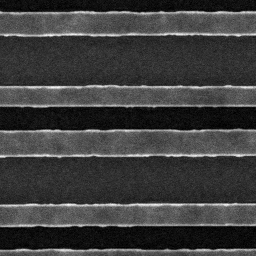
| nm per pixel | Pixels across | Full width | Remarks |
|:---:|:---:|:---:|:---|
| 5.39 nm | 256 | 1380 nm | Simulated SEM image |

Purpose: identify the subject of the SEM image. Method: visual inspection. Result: lines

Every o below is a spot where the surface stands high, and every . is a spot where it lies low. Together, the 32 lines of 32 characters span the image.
................................
.........ooo.oooo...o.oooo.oo.oo
oooooooooooooooooooooooooooooooo
oooooooooooooooooooooooooooooooo
................................
................................
................................
................................
................................
................................
................................
oooooooooooooooooooooooooooooooo
oooooooooooooooooooooooooooooooo
................................
................................
................................
oooooooooooooooooooooooooooooooo
oooooooooooooooooooooooooooooooo
oooooooooooooooooooooooooooooooo
ooooooooooooooooooo.ooooooo..oo.
................................
................................
................................
................................
................................
................................
oooooooooooooooooooooooooooooooo
oooooooooooooooooooooooooooooooo
................................
................................
................................
oooooooooooooooooooooooooooooooo